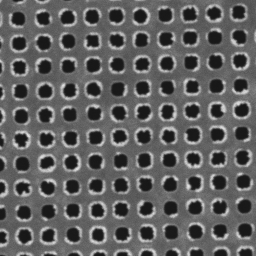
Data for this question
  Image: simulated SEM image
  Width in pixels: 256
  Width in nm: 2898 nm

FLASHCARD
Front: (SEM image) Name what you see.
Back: a regular array of holes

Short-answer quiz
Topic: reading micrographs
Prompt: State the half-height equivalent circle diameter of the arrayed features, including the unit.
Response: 0.159 micrometres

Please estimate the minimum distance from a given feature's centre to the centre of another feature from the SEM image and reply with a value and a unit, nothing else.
270 nm